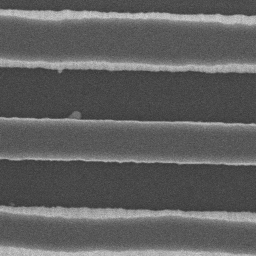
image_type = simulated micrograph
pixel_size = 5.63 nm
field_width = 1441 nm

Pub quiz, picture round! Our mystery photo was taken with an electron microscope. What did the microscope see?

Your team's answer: lines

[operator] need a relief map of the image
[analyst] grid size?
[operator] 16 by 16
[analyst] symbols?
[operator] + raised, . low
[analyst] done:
................
++++++++++++++++
++++++++++++++++
++++++++++++++++
................
................
................
+++++...........
++++++++++++++++
++++++++++++++++
................
................
................
++++++++++++++++
++++++++++++++++
++++++++++++++++